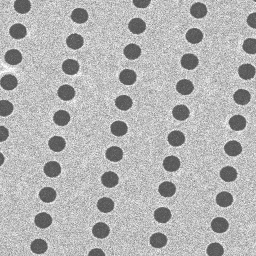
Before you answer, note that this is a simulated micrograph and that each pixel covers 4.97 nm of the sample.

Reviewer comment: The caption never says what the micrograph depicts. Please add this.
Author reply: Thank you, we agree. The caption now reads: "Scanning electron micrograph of a regular array of holes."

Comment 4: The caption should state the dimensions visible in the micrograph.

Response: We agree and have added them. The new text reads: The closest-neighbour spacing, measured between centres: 128 nanometres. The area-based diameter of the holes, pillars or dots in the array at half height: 85.4 nm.